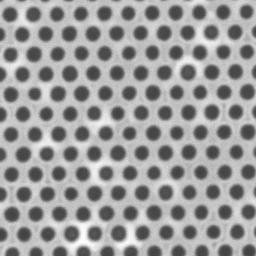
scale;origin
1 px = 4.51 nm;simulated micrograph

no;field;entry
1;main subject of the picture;a regular array of holes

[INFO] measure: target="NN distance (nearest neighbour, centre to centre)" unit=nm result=104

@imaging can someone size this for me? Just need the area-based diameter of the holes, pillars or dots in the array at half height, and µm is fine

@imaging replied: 0.0673